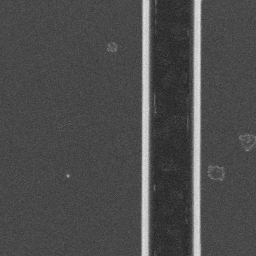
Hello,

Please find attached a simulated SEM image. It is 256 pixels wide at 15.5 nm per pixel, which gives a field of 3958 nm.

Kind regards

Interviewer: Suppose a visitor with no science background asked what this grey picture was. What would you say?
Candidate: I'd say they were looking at one or a few lines or trenches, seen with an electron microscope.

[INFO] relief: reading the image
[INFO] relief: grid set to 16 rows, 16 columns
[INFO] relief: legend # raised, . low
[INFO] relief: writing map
#########...####
#########...####
#########...####
#########...####
#########...####
#########...####
#########...####
#########...####
#########...####
#########...####
#########...####
#########...####
#########...####
#########...####
#########...####
#########...####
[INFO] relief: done